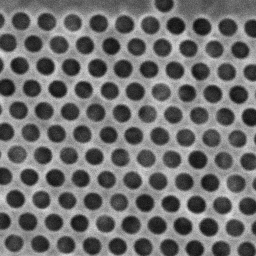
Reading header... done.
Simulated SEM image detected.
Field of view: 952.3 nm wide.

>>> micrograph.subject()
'a regular array of holes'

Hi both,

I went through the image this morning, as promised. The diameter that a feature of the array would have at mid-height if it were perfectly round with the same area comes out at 0.0698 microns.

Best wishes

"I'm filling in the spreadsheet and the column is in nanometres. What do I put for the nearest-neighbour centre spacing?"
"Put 94.8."